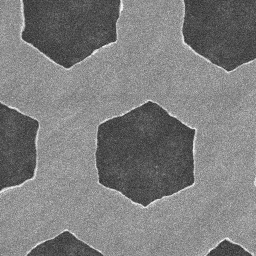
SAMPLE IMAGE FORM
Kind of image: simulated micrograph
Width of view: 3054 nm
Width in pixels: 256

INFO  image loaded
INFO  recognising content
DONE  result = holes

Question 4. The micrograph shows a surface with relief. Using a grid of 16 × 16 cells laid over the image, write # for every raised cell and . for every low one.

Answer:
#.......####....
#......####.....
##.....#####....
###...#######...
################
################
#########.######
..#####....#####
..####......####
..####......####
..####......####
.#####......####
########..######
################
################
##....#######..#